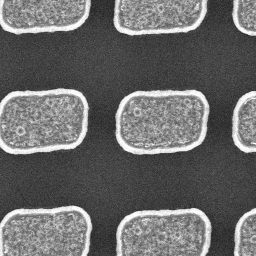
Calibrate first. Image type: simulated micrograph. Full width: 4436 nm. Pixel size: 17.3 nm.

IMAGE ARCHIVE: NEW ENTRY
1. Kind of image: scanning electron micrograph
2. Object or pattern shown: raised bodies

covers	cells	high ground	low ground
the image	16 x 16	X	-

XXXXXX-XXXXXX--X
XXXXX--XXXXX---X
----------------
----------------
----------------
----------------
XXXXX---XXXXX--X
XXXXX--XXXXXX--X
XXXXX--XXXXXX--X
----------------
----------------
----------------
----------------
-XXXX---XXXXX--X
XXXXXX-XXXXXX--X
XXXXX--XXXXXX--X